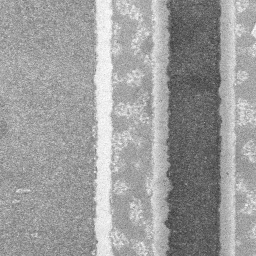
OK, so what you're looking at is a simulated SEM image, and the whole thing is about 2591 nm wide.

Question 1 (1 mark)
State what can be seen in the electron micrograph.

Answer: one or a few lines or trenches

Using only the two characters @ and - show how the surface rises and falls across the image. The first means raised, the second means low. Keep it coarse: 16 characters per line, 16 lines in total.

-------@@@----@@
-------@@@----@@
-------@@@----@@
-------@@@----@@
-------@@@----@@
-------@@@----@@
-------@@@----@@
-------@@@----@@
-------@@@----@@
-------@@@----@@
------@@@@----@@
------@@@@----@@
------@@@@----@@
-------@@@----@@
------@@@@----@@
------@@@@----@@